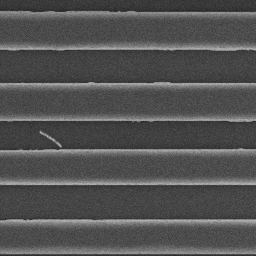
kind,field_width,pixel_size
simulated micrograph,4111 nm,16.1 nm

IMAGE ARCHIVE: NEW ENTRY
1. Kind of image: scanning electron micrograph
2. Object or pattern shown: lines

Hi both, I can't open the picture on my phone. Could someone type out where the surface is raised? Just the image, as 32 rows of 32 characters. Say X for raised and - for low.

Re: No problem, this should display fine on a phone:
--------------------------------
--------------------------------
XXXXXXXXXXXXXXXXXXXXXXXXXXXXXXXX
XXXXXXXXXXXXXXXXXXXXXXXXXXXXXXXX
XXXXXXXXXXXXXXXXXXXXXXXXXXXXXXXX
XXXXXXXXXXXXXXXXXXXXXXXXXXXXXXXX
--------------------------------
--------------------------------
--------------------------------
--------------------------------
XXXXXXXXXXXXXXXXXXXXXXXXXXXXXXXX
XXXXXXXXXXXXXXXXXXXXXXXXXXXXXXXX
XXXXXXXXXXXXXXXXXXXXXXXXXXXXXXXX
XXXXXXXXXXXXXXXXXXXXXXXXXXXXXXXX
XXXXXXXXXXXXXXXXXXXXXXXXXXXXXXXX
--------------------------------
--------------------------------
--------------------------------
--------------------------------
XXXXXXXXXXXXXXXXXXXXXXXXXXXXXXXX
XXXXXXXXXXXXXXXXXXXXXXXXXXXXXXXX
XXXXXXXXXXXXXXXXXXXXXXXXXXXXXXXX
XXXXXXXXXXXXXXXXXXXXXXXXXXXXXXXX
--------------------------------
--------------------------------
--------------------------------
--------------------------------
--------------------------------
XXXXXXXXXXXXXXXXXXXXXXXXXXXXXXXX
XXXXXXXXXXXXXXXXXXXXXXXXXXXXXXXX
XXXXXXXXXXXXXXXXXXXXXXXXXXXXXXXX
XXXXXXXXXXXXXXXXXXXXXXXXXXXXXXXX